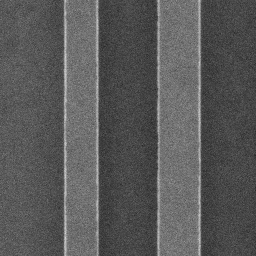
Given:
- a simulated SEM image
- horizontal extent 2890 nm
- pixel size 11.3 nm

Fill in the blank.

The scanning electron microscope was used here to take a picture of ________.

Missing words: lines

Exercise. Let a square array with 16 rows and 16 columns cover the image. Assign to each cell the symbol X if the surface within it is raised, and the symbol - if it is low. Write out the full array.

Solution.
----XX----XX----
----XX----XX----
----XX----XX----
----XX----XX----
----XX----XX----
----XX----XX----
----XX----XX----
----XX----XX----
----XX----XX----
----XX----XX----
----XX----XX----
----XX----XX----
----XX----XX----
----XX----XX----
----XX----XX----
----XX----XX----